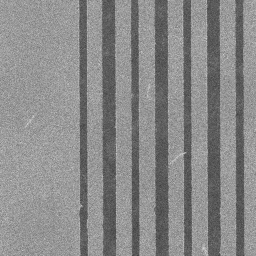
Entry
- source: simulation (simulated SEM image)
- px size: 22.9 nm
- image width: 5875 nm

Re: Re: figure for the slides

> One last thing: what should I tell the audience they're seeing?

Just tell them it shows parallel lines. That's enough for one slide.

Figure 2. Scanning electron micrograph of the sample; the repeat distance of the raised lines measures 610 nanometres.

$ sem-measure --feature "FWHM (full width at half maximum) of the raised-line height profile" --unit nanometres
350